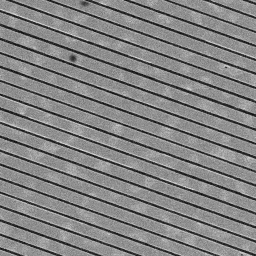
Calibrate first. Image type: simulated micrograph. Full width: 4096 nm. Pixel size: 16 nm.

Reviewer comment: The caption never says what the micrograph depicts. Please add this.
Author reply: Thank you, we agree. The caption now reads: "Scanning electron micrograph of parallel lines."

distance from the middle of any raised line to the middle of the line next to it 211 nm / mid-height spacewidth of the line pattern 47.1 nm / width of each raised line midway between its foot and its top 0.164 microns